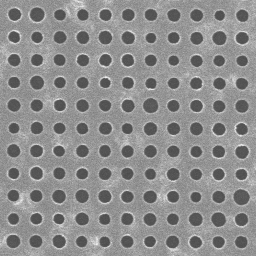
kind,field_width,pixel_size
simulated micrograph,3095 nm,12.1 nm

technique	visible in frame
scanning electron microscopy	a regular array of holes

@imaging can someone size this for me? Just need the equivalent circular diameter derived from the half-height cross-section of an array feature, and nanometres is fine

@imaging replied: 148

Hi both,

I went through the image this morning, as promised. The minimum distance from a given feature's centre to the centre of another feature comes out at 271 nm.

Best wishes